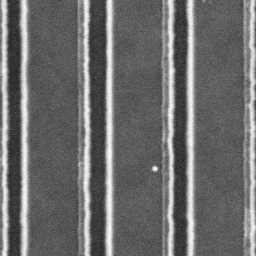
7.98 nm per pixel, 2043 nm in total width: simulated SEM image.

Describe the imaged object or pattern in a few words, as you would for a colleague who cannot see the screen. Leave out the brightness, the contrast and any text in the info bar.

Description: lines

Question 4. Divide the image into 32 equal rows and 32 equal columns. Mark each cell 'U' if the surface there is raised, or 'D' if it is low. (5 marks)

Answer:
DDDUUUUUUUUDDDUUUUUUUDDDUUUUUUUU
DDDUUUUUUUUDDDUUUUUUUDDDUUUUUUUU
DDDUUUUUUUUDDDUUUUUUUDDDUUUUUUUU
DDDUUUUUUUUDDDUUUUUUUDDDUUUUUUUD
DDDUUUUUUUUDDDUUUUUUUDDDUUUUUUUD
DDDUUUUUUUUDDDUUUUUUUDDDUUUUUUUD
DDDUUUUUUUUDDDUUUUUUUDDDUUUUUUUU
DDDUUUUUUUUDDDUUUUUUUDDDUUUUUUUU
UDDUUUUUUUUDDDUUUUUUUDDDUUUUUUUD
UDDUUUUUUUUDDDUUUUUUUDDDUUUUUUUD
DDDUUUUUUUUDDDUUUUUUUDDDUUUUUUUU
DDDUUUUUUUUDDDUUUUUUUDDDUUUUUUUD
UDDUUUUUUUUDDDUUUUUUUDDDUUUUUUUU
DDDUUUUUUUUDDDUUUUUUUDDDUUUUUUUD
DDDUUUUUUUUDDDUUUUUUUDDDUUUUUUUD
UDDUUUUUUUUDDDUUUUUUUDDDUUUUUUUU
DDDUUUUUUUUDDDUUUUUUUDDDUUUUUUUU
UDDUUUUUUUUDDDUUUUUUUDDDUUUUUUUD
UDDUUUUUUUUDDDUUUUUUUDDDUUUUUUUD
UDDUUUUUUUUDDDUUUUUUUDDDUUUUUUUU
UDDUUUUUUUUDDDUUUUUUUDDDUUUUUUUD
UDDUUUUUUUUDDDUUUUUUUDDDUUUUUUUU
DDDUUUUUUUUDDDUUUUUUUDDDUUUUUUUU
UDDUUUUUUUUDDDUUUUUUUDDDUUUUUUUU
UDDUUUUUUUUDDDUUUUUUUDDDUUUUUUUD
UDDUUUUUUUUDDDUUUUUUUDDDUUUUUUUD
UDDUUUUUUUUDDDUUUUUUUDDDUUUUUUUU
UDDUUUUUUUUDDDUUUUUUUDDDUUUUUUUU
UDDUUUUUUUUDDDUUUUUUUDDDUUUUUUUU
UDDUUUUUUUUDDDUUUUUUUDDDUUUUUUUU
UDDUUUUUUUUDDDUUUUUUUDDDUUUUUUUU
UDDUUUUUUUUDDDUUUUUUUDDDUUUUUUUU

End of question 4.